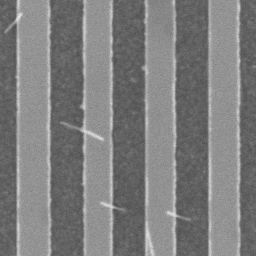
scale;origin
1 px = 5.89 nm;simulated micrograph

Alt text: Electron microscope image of lines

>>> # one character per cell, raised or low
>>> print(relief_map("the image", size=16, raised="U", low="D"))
DUUDDUUDDUUDDUUD
DUUDDUUDDUUDDUUD
DUUDDUUDDUUDDUUD
DUUDDUUDDUUDDUUD
DUUDDUUDDUUDDUUD
DUUDDUUDDUUDDUUD
DUUDDUUDDUUDDUUD
DUUDDUUDDUUDDUUD
DUUDDUUDDUUDDUUD
DUUDDUUDDUUDDUUD
DUUDDUUDDUUDDUUD
DUUDDUUDDUUDDUUD
DUUDDUUDDUUDDUUD
DUUDDUUDDUUDDUUD
DUUDDUUDDUUDDUUD
DUUDDUUDDUUDDUUD